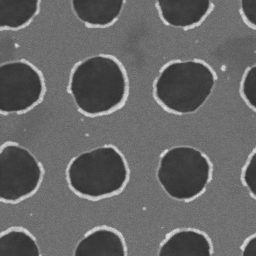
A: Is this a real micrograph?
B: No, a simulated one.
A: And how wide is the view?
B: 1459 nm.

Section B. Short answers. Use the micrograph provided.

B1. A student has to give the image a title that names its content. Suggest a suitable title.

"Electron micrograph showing holes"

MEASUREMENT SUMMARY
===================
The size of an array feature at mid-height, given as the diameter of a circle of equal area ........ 52.5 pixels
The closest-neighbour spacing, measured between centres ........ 490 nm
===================